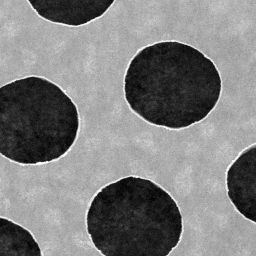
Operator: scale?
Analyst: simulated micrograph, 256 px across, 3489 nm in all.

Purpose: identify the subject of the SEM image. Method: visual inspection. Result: holes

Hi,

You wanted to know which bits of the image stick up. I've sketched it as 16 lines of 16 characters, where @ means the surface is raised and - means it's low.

@@-----@@@@@@@@@
@@@@-@@@@@@@@@@@
@@@@@@@@@@@@@@@@
@@@@@@@@-----@@@
@@@@@@@@------@@
----@@@@------@@
-----@@@-----@@@
-----@@@@---@@@@
-----@@@@@@@@@@@
----@@@@@@@@@@@-
@@@@@@@@@@@@@@--
@@@@@@@---@@@@--
@@@@@@-----@@@--
@@@@@------@@@@-
--@@@@-----@@@@@
--@@@@-----@@@@@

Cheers